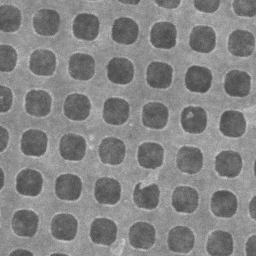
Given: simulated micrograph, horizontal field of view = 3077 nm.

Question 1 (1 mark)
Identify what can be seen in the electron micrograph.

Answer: a regular array of holes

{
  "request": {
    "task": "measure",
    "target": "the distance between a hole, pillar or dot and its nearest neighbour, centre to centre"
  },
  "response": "469 nm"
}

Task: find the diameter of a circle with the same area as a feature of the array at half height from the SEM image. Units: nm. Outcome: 352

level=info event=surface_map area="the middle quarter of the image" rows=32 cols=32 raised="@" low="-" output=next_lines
@-------@@@-------@@@------@@@@@
@-------@@@-------@@@------@@@@-
@-------@@@-------@@-------@@@--
@@-----@@@@-------@@-------@@@--
@@@@@@@@@@@@-----@@@@------@@@--
@@@@@@@@@@@@@@@@@@@@@------@@@--
@@@@@@@@@@@@@@@@@@@@@@@@@@@@@@@-
@----@@@@@@@@@@@@@@@@@@@@@@@@@@@
------@@@@@---@@@@@@@@@@@@@@@@@@
-------@@@------@@@@@---@@@@@@@@
-------@@@------@@@@------@@@@@-
-------@@@------@@@-------@@@@--
------@@@-------@@@-------@@@--@
@-----@@@@------@@@-------@@@---
@@@@@@@@@@------@@@-------@@@---
@@@@@@@@@@@@@@@@@@@@------@@@---
@@@@@@@@@@@@@@@@@@@@@@--@@@@@@--
----@@@@@@@@@@@@@@@@@@@@@@@@@@@-
-----@@@@@---@@@@@@@@@@@@@@@@@@@
------@@@------@@@@@---@@@@@@@@@
------@@@-------@@@------@@@@@--
------@@--------@@-------@@@@---
-----@@@@-------@@-------@@@----
-----@@@@------@@@-------@@@----
@@-@@@@@@@-----@@@-------@@@----
@@@@@@@@@@@@@@@@@@@-----@@@@----
@@@@@@@@@@@@@@@@@@@@@-@@@@@@@---
---@@@@@@@@@@@@@@@@@@@@@@@@@@@--
----@@@@@---@@@@@@@@@@@@@@@@@@@@
-----@@@------@@@@@@@@@@@@@@@@@@
-----@@@------@@@@-@@---@@@@----
-----@@--------@@-------@@@-----